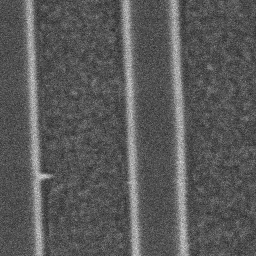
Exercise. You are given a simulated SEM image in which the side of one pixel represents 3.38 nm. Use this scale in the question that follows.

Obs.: one or a few lines or trenches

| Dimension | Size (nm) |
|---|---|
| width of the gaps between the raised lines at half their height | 318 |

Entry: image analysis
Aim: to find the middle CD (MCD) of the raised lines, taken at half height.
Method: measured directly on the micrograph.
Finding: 169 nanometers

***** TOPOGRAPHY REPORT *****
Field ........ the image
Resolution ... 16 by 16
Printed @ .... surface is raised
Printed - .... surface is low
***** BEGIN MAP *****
@@------@@@-----
@@------@@@-----
@@------@@@-----
@@------@@@-----
@@------@@@-----
@@------@@@-----
@@------@@@-----
@@------@@@-----
@@------@@@-----
@@------@@@-----
@@------@@@-----
@@------@@@-----
@@------@@@-----
@@------@@@-----
@@------@@@@----
@@@-----@@@@----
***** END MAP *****